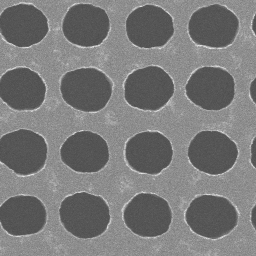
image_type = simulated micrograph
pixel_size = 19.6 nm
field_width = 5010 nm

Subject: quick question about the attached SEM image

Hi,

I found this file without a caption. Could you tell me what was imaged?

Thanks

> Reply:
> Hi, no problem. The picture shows a regular array of holes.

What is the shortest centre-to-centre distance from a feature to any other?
1230 nm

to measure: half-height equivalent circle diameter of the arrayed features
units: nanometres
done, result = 904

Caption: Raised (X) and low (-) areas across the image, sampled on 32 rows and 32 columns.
XXXXXXXXXXXXXXXXXXXXXXXXXXXXXXXX
-----XXX-----XXXX----XXX-----XXX
------XX------XX------XX------XX
------XX------XX------XX------XX
------XX-----XXX-----XXX-----XXX
XX--XXXXX----XXXX----XXXX----XXX
XXXXXXXXXXXXXXXXXXXXXXXXXXXXXXXX
XXXXXXXXXXXXXXXXXXXXXXXXXXXXXXXX
XX-XXXXXXX--XXXXXX--XXXXX--XXXXX
-----XXX-----XXX-----XXX-----XXX
-----XXX------XX------X------XX-
------XX------XX------X------XX-
-----XXX------XX-----XXX-----XXX
XX---XXXX----XXXX---XXXXX---XXXX
XXXXXXXXXXXXXXXXXXXXXXXXXXXXXXXX
XXXXXXXXXXXXXXXXXXXXXXXXXXXXXXXX
XX--XXXXXX-XXXXXXX-XXXXXX--XXXXX
-----XXX-----XXX-----XXX-----XXX
------XX-----XXX-----XXX------X-
------XX------XX------XX------X-
X-----XX-----XXX-----XXX-----XXX
XX--XXXXXX--XXXXXX--XXXXX---XXXX
XXXXXXXXXXXXXXXXXXXXXXXXXXXXXXXX
XXXXXXXXXXXXXXXXXXXXXXXXXXXXXXXX
XX--XXXXX---XXXXX---XXXXX--XXXXX
-----XXX-----XXX-----XXX-----XXX
------X-------XX-----XX-------X-
------XX------XX-----XX-------X-
-----XXX-----XXX-----XXX-----XXX
XXXXXXXXX---XXXXXX--XXXXX---XXXX
XXXXXXXXXXXXXXXXXXXXXXXXXXXXXXXX
XXXXXXXXXXXXXXXXXXXXXXXXXXXXXXXX